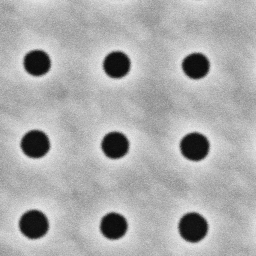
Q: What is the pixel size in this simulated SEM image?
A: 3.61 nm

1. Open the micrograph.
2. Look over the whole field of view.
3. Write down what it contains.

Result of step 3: a regular array of holes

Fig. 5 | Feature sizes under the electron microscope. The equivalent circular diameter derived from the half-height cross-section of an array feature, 0.104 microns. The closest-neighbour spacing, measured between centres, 79.6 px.